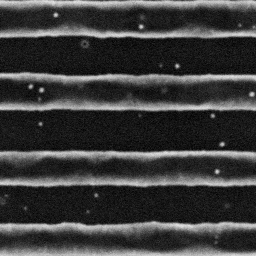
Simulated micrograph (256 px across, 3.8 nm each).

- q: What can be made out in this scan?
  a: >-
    lines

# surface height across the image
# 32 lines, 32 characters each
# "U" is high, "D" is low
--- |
UUUUUUUUUUUUUUUUUUUUUUUUUUUUUUUU
UUUUUUUUUUUUUUUUUUUUUUUUUUUUUUUU
UUUUUUUUUUUUUUUUUUUUUUUUUUUUUUUU
UUUUUUUUUUUUUUUUUUUUUUUUUUUUUUUU
DDDDDDDDDDDDDDDDDUUDDDDDDDDDDDDD
DDDDDDDDDDDDDDDDDDDDDDDDDDDDDDDD
DDDDDDDDDDDDDDDDDDDDDDDDDDDDDDDD
DDDDDDDDDDDDDDDDDDDDDDDDDDDDDDDD
DDDDDDDDDDDDDDDDDDDDDDDDDDDDDDDD
UUUUUUDDDDDDDDDDDDDDDDDDDDDDDDDD
UUUUUUUUUUUUUUUUUUUUUUUUUUUUUUUU
UUUUUUUUUUUUUUUUUUUUUUUUUUUUUUUU
UUUUUUUUUUUUUUUUUUUUUUUUUUUUUUUU
UDDUUUDDDDDDDUUDDDUUDUUUUUDDDDDD
DDDDDDDDDDDDDDDDDDDDDDDDDDDDDDDD
DDDDDDDDDDDDDDDDDDDDDDDDDDDDDDDD
DDDDDDDDDDDDDDDDDDDDDDDDDDDDDDDD
DDDDDDDDDDDDDDDDDDDDDDDDDDDDDDDD
DDDDDDDDDDDDDDDDDDDDDDDDDDDDDDDD
UUUUUUUUUUUUUUUUUUUUUUUUUUUUUUUU
UUUUUUUUUUUUUUUUUUUUUUUUUUUUUUUU
UUUUUUUUUUUUUUUUUUUUUUUUUUUUUUUU
UUUUUUUUUUUUUUUUUUUUUUUUUUUUUUUU
DDDDDDDDDDDDDDDDDDDDDDDDDDDDDDDD
DDDDDDDDDDDDDDDDDDDDDDDDDDDDDDDD
DDDDDDDDDDDDDDDDDDDDDDDDDDDDDDDD
DDDDDDDDDDDDDDDDDDDDDDDDDDDDDDDD
DDDDDDDDDDDDDDDDDDDDDDDDDDDDDDDD
UUUUUUUUUUUUUUUUUUUUUUUUUUUUUUUU
UUUUUUUUUUUUUUUUUUUUUUUUUUUUUUUU
UUUUUUUUUUUUUUUUUUUUUUUUUUUUUUUU
UUUUUUUUUUUUUUUUUUUUUUUUUUUUUUUU